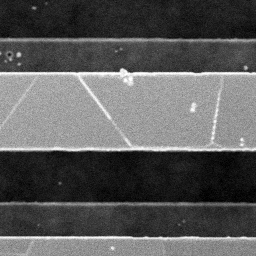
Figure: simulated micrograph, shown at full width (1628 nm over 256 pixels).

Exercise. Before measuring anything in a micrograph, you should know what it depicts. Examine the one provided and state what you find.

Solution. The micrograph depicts lines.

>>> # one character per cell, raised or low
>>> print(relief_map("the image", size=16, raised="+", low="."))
................
................
++.+..+++.......
++++++++++++++++
++++++++++++++++
++++++++++++++++
++++++++++++++++
++++++++++++++++
++++++++++++++++
................
................
................
................
++++++++++++++++
++++++++++++++++
++++++++++++++++